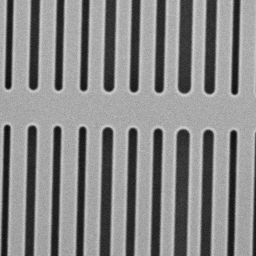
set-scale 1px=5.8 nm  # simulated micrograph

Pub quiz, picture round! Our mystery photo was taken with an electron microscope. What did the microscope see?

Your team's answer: groups of lines, slits or small figures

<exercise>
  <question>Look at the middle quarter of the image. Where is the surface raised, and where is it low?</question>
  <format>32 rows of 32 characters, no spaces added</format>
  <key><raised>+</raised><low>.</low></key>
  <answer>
++++..++++...+++...++++..+++....
++++..++++...+++...++++..+++....
++++..++++...+++...++++..+++....
++++..++++...+++...+++...+++....
++++..++++...+++...+++...+++....
++++..++++...+++...+++...+++....
++++..++++..+++++..++++..++++...
++++++++++++++++++++++++++++++++
++++++++++++++++++++++++++++++++
++++++++++++++++++++++++++++++++
++++++++++++++++++++++++++++++++
++++++++++++++++++++++++++++++++
++++++++++++++++++++++++++++++++
++++++++++++++++++++++++++++++++
++++++++++++++++++++++++++++++++
++++++++++++++++++++++++++++++++
++++..++++..++++..+++++..++++..+
+++...+++...++++...+++...+++...+
+++...+++...++++..++++...+++....
+++...+++...++++..++++...+++....
+++...+++...++++..++++...+++....
+++...+++...++++..++++...+++....
+++...+++...++++..++++...+++...+
+++...+++...++++..++++...+++...+
+++...+++...++++..++++...+++...+
+++...+++...++++..++++...+++...+
+++...+++...++++..++++...+++...+
+++...+++...++++..++++...+++...+
+++..++++...++++..++++...+++...+
+++..++++...++++..++++...+++...+
+++..++++...++++..++++...+++...+
+++..++++...++++..++++...+++...+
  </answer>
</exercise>